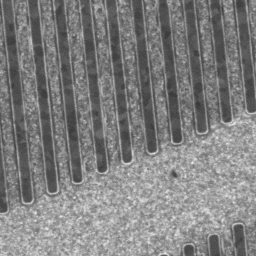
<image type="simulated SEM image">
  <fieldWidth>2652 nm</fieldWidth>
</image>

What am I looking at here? parallel lines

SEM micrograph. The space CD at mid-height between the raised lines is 146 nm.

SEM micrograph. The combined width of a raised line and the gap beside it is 266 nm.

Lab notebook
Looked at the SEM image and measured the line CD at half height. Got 0.117 um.